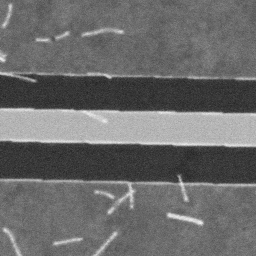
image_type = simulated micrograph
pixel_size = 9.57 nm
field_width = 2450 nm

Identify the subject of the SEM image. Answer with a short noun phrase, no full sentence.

lines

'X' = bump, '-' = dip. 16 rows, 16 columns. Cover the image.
XXXXXXXXXXXXXXXX
XXXXXXXXXXXXXXXX
XXXXXXXXXXXXXXXX
XXXXXXXXXXXXXXXX
XXXXXXXXXXXXXXXX
----------------
----------------
XXXXXXXXXXXXXXXX
XXXXXXXXXXXXXXXX
----------------
----------------
XXXXXXXXXXXXX---
XXXXXXXXXXXXXXXX
XXXXXXXXXXXXXXXX
XXXXXXXXXXXXXXXX
XXXXXXXXXXXXXXXX